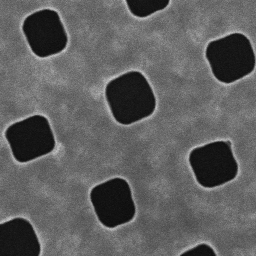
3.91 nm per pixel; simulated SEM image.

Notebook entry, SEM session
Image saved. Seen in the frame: holes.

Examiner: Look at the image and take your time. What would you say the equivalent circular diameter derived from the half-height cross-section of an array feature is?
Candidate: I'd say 0.181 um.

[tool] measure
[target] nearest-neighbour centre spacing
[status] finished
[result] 0.413 um